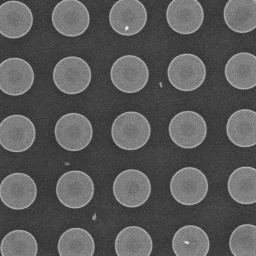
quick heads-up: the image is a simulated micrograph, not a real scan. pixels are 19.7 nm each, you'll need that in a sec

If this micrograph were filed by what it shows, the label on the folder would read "an array of small figures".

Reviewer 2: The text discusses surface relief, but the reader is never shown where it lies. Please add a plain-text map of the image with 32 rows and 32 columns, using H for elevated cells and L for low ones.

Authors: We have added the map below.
HHHLLLLHHHLLLLHHHHLLLHHHHLLLHHHH
HHHHLLLHHHHLLLHHHHLLLHHHHLLLHHHH
HHHHLLLHHHHLLLHHHHLLLHHHHLLLHHHH
HHHHLLLHHHHLLLHHHHLLLLHHHLLLLHHH
LHHLLLLLLLLLLLLLLLLLLLLLLLLLLLLL
LLLLLLLLLLLLLLLLLLLLLLLLLLLLLLLL
LLLLLLLLLLLLLLLLLLLLLLLLLLLLLLLL
LHHLLLLLHHLLLLLHHHLLLLHHHLLLLHHH
HHHHLLLHHHHLLLHHHHLLLHHHHHLLHHHH
HHHHLLLHHHHLLLHHHHHLLHHHHHLLHHHH
HHHHLLLHHHHLLLHHHHLLLLHHHLLLLHHH
LHHLLLLLHHLLLLLLHLLLLLLLLLLLLLLL
LLLLLLLLLLLLLLLLLLLLLLLLLLLLLLLL
LLLLLLLLLLLLLLLLLLLLLLLLLLLLLLLL
LHHLLLLLHHLLLLLHHHLLLLHHHLLLLHHH
HHHHLLLHHHHLLLHHHHHLLHHHHHLLHHHH
HHHHLLLHHHHLLLHHHHHLLHHHHHLLHHHH
HHHHLLLHHHHLLLHHHHLLLLHHHLLLLHHH
LHHLLLLLHHLLLLLHHLLLLLLLLLLLLLLL
LLLLLLLLLLLLLLLLLLLLLLLLLLLLLLLL
LLLLLLLLLLLLLLLLLLLLLLLLLLLLLLLL
LLLLLLLLLHLLLLLHHHLLLLHHHLLLLHHH
HHHHLLLHHHHLLLHHHHHLLHHHHHLLLHHH
HHHHLLLHHHHHLLHHHHHLLHHHHHLLLHHH
HHHHLLLHHHHHLLHHHHHLLLHHHHLLLHHH
LHHHLLLLHHHLLLLHHHLLLLLHLLLLLLLL
LLLLLLLLLLLLLLLLLLLLLLLLLLLLLLLL
LLLLLLLLLLLLLLLLLLLLLLLLLLLLLLLL
LLLLLLLLLLLLLLLLHHLLLLLHHLLLLLHH
LHHHLLLLHHHLLLLHHHHLLLHHHHLLLHHH
HHHHHLLHHHHHLLHHHHHLLLHHHHLLLHHH
HHHHHLLHHHHHLLLHHHHLLLHHHHLLLHHH